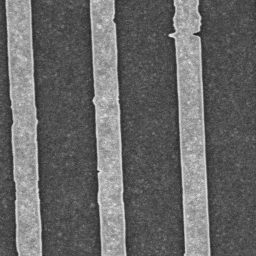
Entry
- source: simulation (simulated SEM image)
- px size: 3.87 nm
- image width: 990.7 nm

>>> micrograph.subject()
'one or a few lines or trenches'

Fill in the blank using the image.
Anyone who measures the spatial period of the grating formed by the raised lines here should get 325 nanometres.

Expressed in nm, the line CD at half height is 94.7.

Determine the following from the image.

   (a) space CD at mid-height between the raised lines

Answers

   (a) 230 nanometres